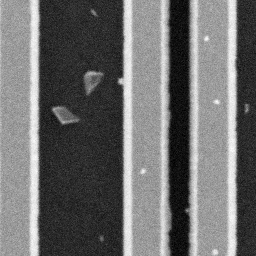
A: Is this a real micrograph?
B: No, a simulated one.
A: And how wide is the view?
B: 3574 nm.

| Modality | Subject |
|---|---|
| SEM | lines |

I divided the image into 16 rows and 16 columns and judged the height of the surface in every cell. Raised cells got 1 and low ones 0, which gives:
1100000011001110
1100000011001110
1100000011001110
1100000011001110
1100000011001110
1100000011001110
1100000011001110
1100000011001110
1100000011001110
1100000011001110
1100000011001110
1100000011001110
1100000011001110
1100000011001110
1100000011001110
1100000011001110